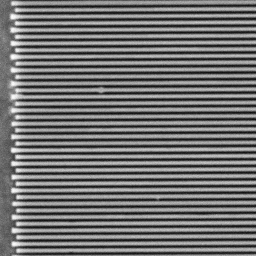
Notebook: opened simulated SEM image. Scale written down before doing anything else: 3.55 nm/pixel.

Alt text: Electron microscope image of parallel lines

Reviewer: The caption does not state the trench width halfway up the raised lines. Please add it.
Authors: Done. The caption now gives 10.2 nm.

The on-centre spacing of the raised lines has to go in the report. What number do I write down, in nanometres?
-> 23.7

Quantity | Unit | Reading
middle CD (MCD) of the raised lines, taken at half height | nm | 13.7